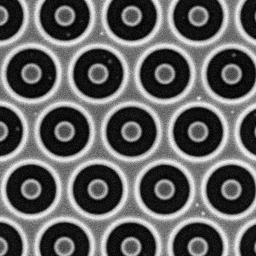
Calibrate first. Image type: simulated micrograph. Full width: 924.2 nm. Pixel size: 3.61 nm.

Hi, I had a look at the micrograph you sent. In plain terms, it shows an array of small figures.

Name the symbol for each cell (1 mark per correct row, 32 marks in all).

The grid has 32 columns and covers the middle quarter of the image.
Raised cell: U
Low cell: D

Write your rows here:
UUDDDDDUUUDDDDDUUUUDDDDDUUUDDDDD
UUDDDDUUUUUDDDDUUUDDDDDUUUUDDDDD
UUDDDDUUUUUDDDDUUUDDDDDUUUUDDDDD
UUDDDDUUUUUDDDDUUUDDDDDUUUUDDDDD
UUDDDDDUUUDDDDDUUUUDDDDDUUUDDDDD
UUUDDDDDDDDDDDUUUUUDDDDDDDDDDDDU
UUUDDDDDDDDDDDUUUUUUDDDDDDDDDDDU
UUUUDDDDDDDDDUUUUUUUUDDDDDDDDDUU
UUUUUDDDDDDDUUUUUUUUUUDDDDDDUUUU
UUUUUUUUUUUUUUUUUUUUUUUUUUUUUUUU
DDUUUUUUUUUUUUUDDDDUUUUUUUUUUUUD
DDDDUUUUUUUUUDDDDDDDDUUUUUUUUUDD
DDDDDUUUUUUUDDDDDDDDDDUUUUUUDDDD
DDDDDDUUUUUDDDDDDDDDDDDUUUUUDDDD
UDDDDDUUUUUDDDDDUDDDDDDUUUUDDDDD
UUDDDDDUUUDDDDDUUUUDDDDUUUUDDDDU
UUUDDDDUUUDDDDUUUUUDDDDDUUUDDDDU
UUUDDDDUUUDDDDUUUUUDDDDDUUUDDDDU
UUDDDDDUUUDDDDDUUUUDDDDUUUUDDDDD
DDDDDDUUUUUDDDDDDDDDDDDUUUUDDDDD
DDDDDDUUUUUDDDDDDDDDDDUUUUUUDDDD
DDDDDUUUUUUUDDDDDDDDDDUUUUUUUDDD
DDDDUUUUUUUUUDDDDDDDDUUUUUUUUUDD
DUUUUUUUUUUUUUUUDDUUUUUUUUUUUUUU
UUUUUUUUUUUUUUUUUUUUUUUUUUUUUUUU
UUUUUDDDDDDDUUUUUUUUUUDDDDDDUUUU
UUUUDDDDDDDDDUUUUUUUUDDDDDDDDDUU
UUUDDDDDDDDDDDUUUUUUDDDDDDDDDDDU
UUDDDDDDDDDDDDDUUUUDDDDDDDDDDDDU
UUDDDDDUUUDDDDDUUUUDDDDDUUUDDDDD
UUDDDDUUUUUDDDDUUUDDDDDUUUUDDDDD
UUDDDDUUUUUDDDDUUUDDDDDUUUUDDDDD